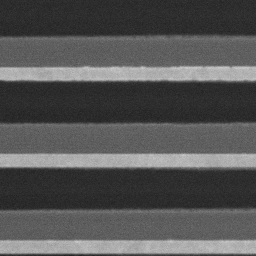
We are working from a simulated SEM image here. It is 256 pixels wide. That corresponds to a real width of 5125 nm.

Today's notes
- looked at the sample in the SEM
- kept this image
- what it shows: lines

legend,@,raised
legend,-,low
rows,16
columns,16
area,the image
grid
----------------
----------------
@@@@@@@@@@@@@@@@
@@@@@@@@@@@@@@@@
@@@@@@@@@@@@@@@@
----------------
----------------
----------------
@@@@@@@@@@@@@@@@
@@@@@@@@@@@@@@@@
----------------
----------------
----------------
@@@@@@@@@@@@@@@@
@@@@@@@@@@@@@@@@
@@@@@@@@@@@@@@@@